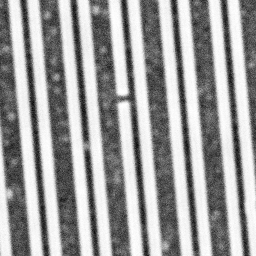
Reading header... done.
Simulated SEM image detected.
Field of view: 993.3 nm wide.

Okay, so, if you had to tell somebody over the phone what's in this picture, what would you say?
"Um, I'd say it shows parallel lines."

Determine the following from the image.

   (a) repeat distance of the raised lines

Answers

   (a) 94.6 nm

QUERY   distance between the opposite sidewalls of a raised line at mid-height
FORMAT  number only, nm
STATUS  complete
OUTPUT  37.7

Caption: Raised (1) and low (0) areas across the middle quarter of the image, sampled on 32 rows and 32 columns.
11100110000001100011000001110011
01100110000001100011000000110011
01100111000001100011000000110011
01100111000001100011000000110011
01100111000001110011000000110011
01100011000001110011000000110001
01100011000001110011000000110001
01100011000000110011000000110001
01100011000000000011100000110001
01100011000000000011100000111001
01110011000000110011100000111001
01110011000000110001100000111001
01110011000000110001100000011001
00110011100000110001100000011001
00110011100000110001100000011001
00110011100000111001100000011001
00110001100000111001100000011000
00110001100000111001100000011000
00110001100000011001100000011000
00110001100000011001110000011000
00110001100000011001110000011000
00111001100000011001110000011100
00111001100000011000110000011100
00111001100000011000110000011100
00011001110000011000110000001100
00011001110000011000110000001100
00011001110000011100110000001100
00011000110000011100110000001100
00011000110000011100110000001100
00011000110000001100110000001100
00011000110000001100111000001100
00011000110000001100111000001100